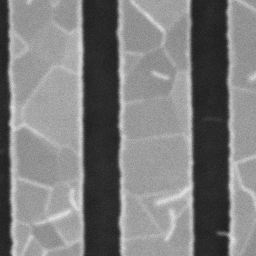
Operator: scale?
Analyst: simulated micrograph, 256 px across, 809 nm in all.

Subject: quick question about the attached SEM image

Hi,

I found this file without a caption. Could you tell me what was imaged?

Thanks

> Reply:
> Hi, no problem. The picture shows lines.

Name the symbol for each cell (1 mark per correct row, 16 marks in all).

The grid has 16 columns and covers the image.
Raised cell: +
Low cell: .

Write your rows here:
.++++..+++++..++
.++++..+++++..++
.++++..+++++..++
.++++..+++++..++
.++++..+++++..++
.++++..+++++..++
.++++...++++..++
.++++..+++++..++
.++++...++++..++
.++++..+++++..++
.++++...++++..++
.++++...++++..++
.++++...++++..++
.++++...++++..++
.++++...++++..++
.++++...++++..++